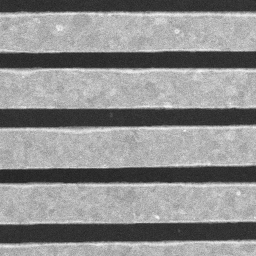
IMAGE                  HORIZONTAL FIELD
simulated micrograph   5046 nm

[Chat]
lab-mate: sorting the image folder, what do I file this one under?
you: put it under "lines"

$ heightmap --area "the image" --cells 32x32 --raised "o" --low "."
................................
................................
oooooooooooooooooooooooooooooooo
oooooooooooooooooooooooooooooooo
oooooooooooooooooooooooooooooooo
oooooooooooooooooooooooooooooooo
................................
................................
................................
oooooooooooooooooooooooooooooooo
oooooooooooooooooooooooooooooooo
oooooooooooooooooooooooooooooooo
oooooooooooooooooooooooooooooooo
oooo.ooooooooo.o................
................................
................................
oooooooooooooooooooooooooooooooo
oooooooooooooooooooooooooooooooo
oooooooooooooooooooooooooooooooo
oooooooooooooooooooooooooooooooo
oooooooooooooooooooooooooooooooo
................................
................................
oooooooooooooooooooooooooooooooo
oooooooooooooooooooooooooooooooo
oooooooooooooooooooooooooooooooo
oooooooooooooooooooooooooooooooo
oooooooooooooooooooooooooooooooo
................................
................................
o.oooooooooooooooooooooooooooooo
oooooooooooooooooooooooooooooooo